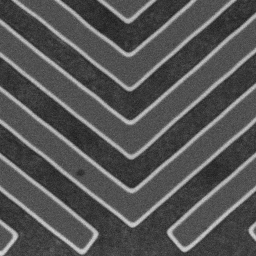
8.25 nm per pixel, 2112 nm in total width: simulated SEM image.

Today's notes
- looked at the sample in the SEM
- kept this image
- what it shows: groups of lines, slits or small figures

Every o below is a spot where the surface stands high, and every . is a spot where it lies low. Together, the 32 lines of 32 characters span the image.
..oooooo.....oooooo.....ooooo...
....ooooo.....oooo.....ooooo....
.....ooooo...........oooooo....o
o.....ooooo.........ooooo.....oo
oo.....oooooo......ooooo.....ooo
oooo.....ooooo....ooooo.....oooo
ooooo.....ooooo..ooooo.....ooooo
.ooooo.....oooooooooo.....ooooo.
..ooooo......ooooooo....oooooo..
...oooooo.....oooo.....ooooo....
.....ooooo.....oo.....ooooo.....
o.....ooooo..........ooooo.....o
oo.....oooooo.......ooooo.....oo
ooo.....oooooo.....ooooo.....ooo
oooo......ooooo..oooooo.....oooo
oooooo.....oooooooooo.....oooooo
..ooooo.....oooooooo.....ooooo..
...ooooo.....oooooo.....ooooo...
....ooooo......ooo.....ooooo....
.....oooooo.....o.....ooooo.....
o......ooooo.........ooooo.....o
ooo.....ooooo......oooooo....ooo
oooo.....ooooo....ooooo.....oooo
ooooo.....oooooo.ooooo.....ooooo
.oooooo.....ooooooooo.....ooooo.
..oooooo.....ooooooo.....ooooo..
....ooooo.....ooooo.....ooooo...
.....ooooo.....ooo.....ooooo....
o.....ooooo..........ooooo.....o
oo.....ooooo.........oooo.......
o........oo...........oo........
o...............................